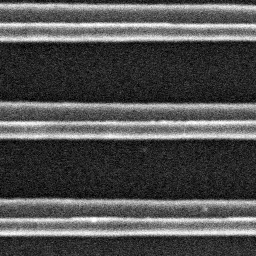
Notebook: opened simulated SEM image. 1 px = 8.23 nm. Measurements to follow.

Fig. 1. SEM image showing lines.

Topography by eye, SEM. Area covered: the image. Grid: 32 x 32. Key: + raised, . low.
................................
++++++++++++++++++++++++++++++++
++++++++++++++++++++++++++++++++
++++++++++++++++++++++++++++++++
++++++++++++++++++++++++++++++++
................................
................................
................................
................................
................................
................................
................................
................................
++++++++++++++++++++++++++++++++
++++++++++++++++++++++++++++++++
++++++++++++++++++++++++++++++++
++++++++++++++++++++++++++++++++
................................
................................
................................
................................
................................
................................
................................
................................
++++++++++++++++++++++++++++++++
++++++++++++++++++++++++++++++++
++++++++++++++++++++++++++++++++
++++++++++++++++++++++++++++++++
................................
................................
................................